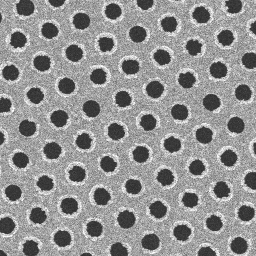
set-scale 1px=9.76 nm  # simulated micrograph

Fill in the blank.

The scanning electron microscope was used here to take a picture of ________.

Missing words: a regular array of holes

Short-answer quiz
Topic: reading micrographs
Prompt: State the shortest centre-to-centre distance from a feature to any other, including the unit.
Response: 322 nanometers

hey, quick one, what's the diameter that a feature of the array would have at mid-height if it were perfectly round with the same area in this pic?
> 163 nanometers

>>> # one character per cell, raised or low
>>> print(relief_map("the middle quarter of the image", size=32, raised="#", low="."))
##############.....#############
#######...#####....#############
#######....#####..###########...
.######....##################...
..#####...############..#####...
...##################....####...
...#################.....#######
.############...#####...########
#############....#####.#########
#####...#####....###############
#####....#####..###########...##
#####....##################....#
.####....############.#####....#
.##################....####....#
.##################....#########
###########...#####....#########
###########....#####..##########
####..#####....#################
###....#####...###########..####
###....##################....###
###....##################....###
##################...#####...###
#################....###########
##########..#####....###########
#########....#####..############
###.#####....##################.
#....#####...###########..#####.
#....##################....#####
#....##################.....####
###.############...#####...#####
###############....#############
########...####....#############